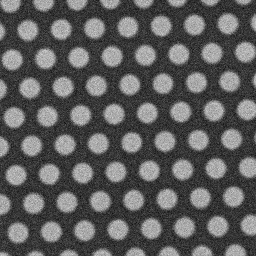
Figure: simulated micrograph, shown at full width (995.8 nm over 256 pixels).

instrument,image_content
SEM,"an array of small figures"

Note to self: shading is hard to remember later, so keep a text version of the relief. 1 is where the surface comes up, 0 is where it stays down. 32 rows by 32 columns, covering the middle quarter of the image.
00011000000000000000000000000000
00000000000000000000000000000000
00000000000000000000000000000000
10000001100000011100000111100001
11000011110000111110000111100001
11000011110000111110000111100001
11000011110000111110000111100000
10000001100000000000000000000000
00000000000000000000000000000000
00000000000000000000000000000000
00001000000111000001110000011110
00111100001111100001111000011110
00111110001111100001111000011110
00111100001111100001111000011110
00011100000111000000100000000000
00000000000000000000000000000000
00000000000000000000000000000000
00000000000000001100000011100000
11000001111000011110000111100001
11000011111000011110000111110001
11100011111000011110000111100000
11000001110000011100000001000000
10000000000000000000000000000000
00000000000000000000000000000000
00000000000000000000110000001110
00011100000111100001111000001111
00111110000111100001111100011111
00011110000111100001111100001111
00011110000111100000111000001110
00001100000000000000000000000000
00000000000000000000000000000000
00000000000000000000000001100000